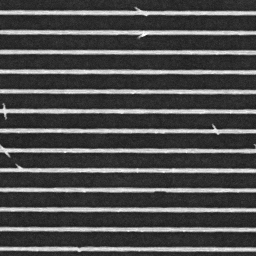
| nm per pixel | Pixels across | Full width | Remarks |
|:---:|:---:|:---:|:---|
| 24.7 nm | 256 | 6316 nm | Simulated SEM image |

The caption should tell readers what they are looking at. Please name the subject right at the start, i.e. parallel lines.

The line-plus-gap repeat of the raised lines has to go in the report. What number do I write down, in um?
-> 0.486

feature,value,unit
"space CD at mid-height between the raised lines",416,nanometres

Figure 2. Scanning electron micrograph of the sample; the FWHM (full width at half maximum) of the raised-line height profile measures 70.9 nm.